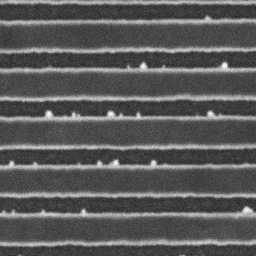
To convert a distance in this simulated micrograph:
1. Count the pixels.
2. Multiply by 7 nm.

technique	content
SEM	lines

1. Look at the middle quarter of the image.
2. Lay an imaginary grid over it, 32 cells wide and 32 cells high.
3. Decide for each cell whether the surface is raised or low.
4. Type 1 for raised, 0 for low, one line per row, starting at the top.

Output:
00000000000000000000000000000000
11111111111111111111111111111111
11111111111111111111111111111111
11111111111111111111111111111111
11111111111111111111111111111111
11111111111111111111111111111111
11111111111111111111111111111111
11111111111111111111111111111111
11111111111111111111111111111111
00000000000000000000000000000000
00000000000000000000000000000000
00000000000000000000000000000000
00000000000100000000000000000000
00100000000111010010111111111001
11111111111111111111111111111111
11111111111111111111111111111111
11111111111111111111111111111111
11111111111111111111111111111111
11111111111111111111111111111111
11111111111111111111111111111111
11111111111111111111111111111111
00000000000000000000000000000000
00000000000000000000000000000000
00000000000000000000000000000000
00000000000000000000000000000000
00000001011011010000001011011011
11111111111111111111111111111111
11111111111111111111111111111111
11111111111111111111111111111111
11111111111111111111111111111111
11111111111111111111111111111111
11111111111111111111111111111111